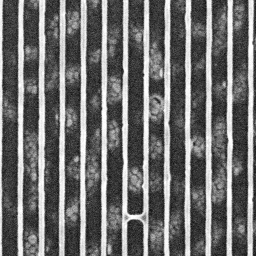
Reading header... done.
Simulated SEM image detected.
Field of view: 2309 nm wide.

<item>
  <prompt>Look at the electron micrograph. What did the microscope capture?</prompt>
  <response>parallel lines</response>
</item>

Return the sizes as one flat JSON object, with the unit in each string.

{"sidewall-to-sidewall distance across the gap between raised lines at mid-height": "151 nm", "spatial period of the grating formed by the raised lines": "188 nm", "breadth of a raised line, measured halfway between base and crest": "38.3 nm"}